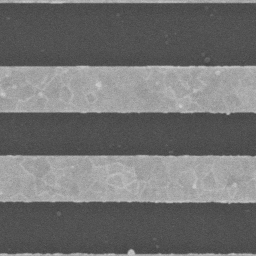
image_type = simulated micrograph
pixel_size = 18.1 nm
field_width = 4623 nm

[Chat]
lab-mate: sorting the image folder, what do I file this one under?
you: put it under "lines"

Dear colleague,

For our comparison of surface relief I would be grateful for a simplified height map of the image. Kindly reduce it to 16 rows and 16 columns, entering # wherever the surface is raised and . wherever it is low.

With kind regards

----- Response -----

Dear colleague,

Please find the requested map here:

................
................
................
................
################
################
################
................
................
................
################
################
################
................
................
................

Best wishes